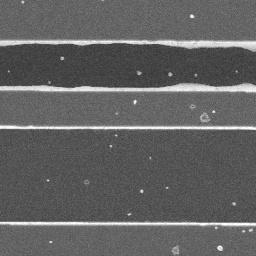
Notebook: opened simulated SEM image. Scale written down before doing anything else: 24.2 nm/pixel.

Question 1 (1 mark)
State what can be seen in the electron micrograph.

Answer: lines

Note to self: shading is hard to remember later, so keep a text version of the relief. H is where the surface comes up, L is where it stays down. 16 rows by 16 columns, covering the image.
HHHHHHHHHHHHHHHH
HHHHHHHHHHHHHHHH
HHHHHHHHHHHHHHHH
LLLLLLLLLLLLLLLL
LLLLLLLLLLLLLLLL
LLLLLLLLLLLLLLLL
HHHHHHHHHHHHHHHH
HHHHHHHHHHHHHHHH
LLLLLLLLLLLLLLLL
LLLLLLLLLLLLLLLL
LLLLLLLLLLLLLLLL
LLLLLLLLLLLLLLLL
LLLLLLLLLLLLLLLL
LLLLLLLLLLLLLLLL
HHHHHHHHHHHHHHHH
HHHHHHHHHHHHHHHH